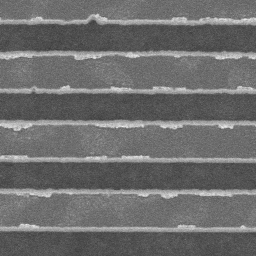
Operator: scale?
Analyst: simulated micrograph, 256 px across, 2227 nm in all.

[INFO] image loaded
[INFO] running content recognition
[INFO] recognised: one or a few lines or trenches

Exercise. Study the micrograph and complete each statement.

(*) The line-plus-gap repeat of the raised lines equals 0.601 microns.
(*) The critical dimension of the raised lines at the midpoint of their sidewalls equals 329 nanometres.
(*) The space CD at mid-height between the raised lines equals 269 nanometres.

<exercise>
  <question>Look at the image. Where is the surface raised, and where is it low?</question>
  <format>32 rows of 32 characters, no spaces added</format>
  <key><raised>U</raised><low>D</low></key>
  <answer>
UUUUUUUUUUUUUUUUUUUUUUUUUUUUUUUU
UUUUUUUUUUUUUUUUUUUUUUUUUUUUUUUU
UUUUUUUUUUUDUUUUUUUUUUUUUUUUUUUU
DDDDDDDDDDDDDDDDDDDDDDDDDDDDDDDD
DDDDDDDDDDDDDDDDDDDDDDDDDDDDDDDD
DDDDDDDDDDDDDDDDDDDDDDDDDDDDDDDD
DDDDDDDDDDDDDDDDDDDDDDDDDDDDDDDD
UUUUUUUUUUUUUUUUUUUUUUUUUUUUUUUU
UUUUUUUUUUUUUUUUUUUUUUUUUUUUUUUU
UUUUUUUUUUUUUUUUUUUUUUUUUUUUUUUU
UUUUUUUUUUUUUUUUUUUUUUUUUUUUUUUU
DDDDDDDUDDDDDDDDDDDDDDDDDDDDDDDU
DDDDDDDDDDDDDDDDDDDDDDDDDDDDDDDD
DDDDDDDDDDDDDDDDDDDDDDDDDDDDDDDD
DDDDDDDDDDDDDDDDDDDDDDDDDDDDDDDD
UUUUUUUUUUUUUUUUUUUUUUUUUUUUUUUU
UUUUUUUUUUUUUUUUUUUUUUUUUUUUUUUU
UUUUUUUUUUUUUUUUUUUUUUUUUUUUUUUU
UUUUUUUUUUUUUUUUUUUUUUUUUUUUUUUU
UUUUUUUUUUUUUUUUUUUUUUUUUUUUUUUU
DDDDDDDDDDDDDDDDDDDDDDDDDDDDDDDD
DDDDDDDDDDDDDDDDDDDDDDDDDDDDDDDD
DDDDDDDDDDDDDDDDDDDDDDDDDDDDDDDD
DDDDDDDDDDDDDDDDDDDDDDDDDDDDDDDD
UUUUUUUUUUUUUUUUUUUUUUUUUUUUUUUU
UUUUUUUUUUUUUUUUUUUUUUUUUUUUUUUU
UUUUUUUUUUUUUUUUUUUUUUUUUUUUUUUU
UUUUUUUUUUUUUUUUUUUUUUUUUUUUUUUU
UUUUUUUUUUUUUUUUUUUUUUUUUUUUUUUU
DDDDDDDDDDDDDDDDDDDDDDDDDDDDDDDD
DDDDDDDDDDDDDDDDDDDDDDDDDDDDDDDD
DDDDDDDDDDDDDDDDDDDDDDDDDDDDDDDD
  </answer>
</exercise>